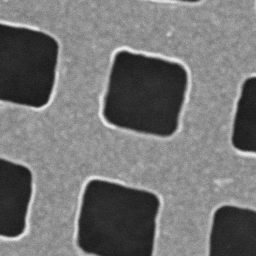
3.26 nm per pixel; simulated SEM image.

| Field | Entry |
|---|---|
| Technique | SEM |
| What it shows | holes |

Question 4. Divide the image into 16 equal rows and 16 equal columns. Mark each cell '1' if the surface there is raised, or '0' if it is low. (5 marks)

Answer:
1111111111111111
1111111111111111
0001111111111111
0000111001111111
0001111000001111
0001111000001110
1001111000011110
1111111000011110
1111111111111100
1111111111111111
0011111111111111
0011110111111111
0011100000111111
0011100000111000
0111100000111000
1111100000111000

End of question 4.